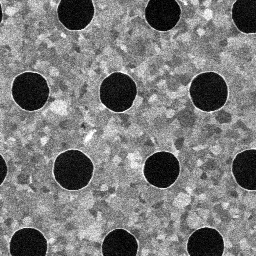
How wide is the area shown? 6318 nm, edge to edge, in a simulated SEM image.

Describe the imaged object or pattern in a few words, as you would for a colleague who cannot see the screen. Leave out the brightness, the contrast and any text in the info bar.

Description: holes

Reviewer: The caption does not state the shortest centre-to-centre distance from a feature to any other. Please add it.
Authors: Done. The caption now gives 2180 nm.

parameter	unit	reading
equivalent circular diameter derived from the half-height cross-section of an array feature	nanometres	954